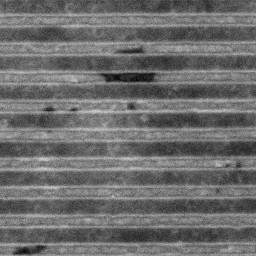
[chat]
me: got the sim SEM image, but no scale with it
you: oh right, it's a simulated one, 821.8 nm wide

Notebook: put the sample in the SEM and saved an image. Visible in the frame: parallel lines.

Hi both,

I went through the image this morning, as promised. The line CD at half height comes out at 61.3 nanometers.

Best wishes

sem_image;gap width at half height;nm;31.7